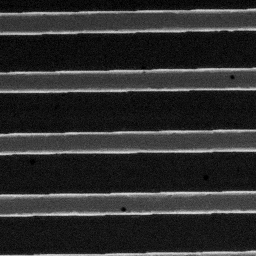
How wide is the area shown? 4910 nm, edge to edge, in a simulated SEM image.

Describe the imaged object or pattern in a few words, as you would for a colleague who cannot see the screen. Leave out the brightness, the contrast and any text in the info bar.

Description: lines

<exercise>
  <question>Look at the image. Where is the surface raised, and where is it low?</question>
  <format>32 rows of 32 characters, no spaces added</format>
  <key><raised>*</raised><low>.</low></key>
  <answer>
................................
...........*********************
********************************
********************************
................................
................................
................................
................................
................................
********************************
********************************
***.............................
................................
................................
................................
................................
......................**********
********************************
********************************
................................
................................
................................
................................
................................
..******************************
********************************
********************************
................................
................................
................................
................................
................................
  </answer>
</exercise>